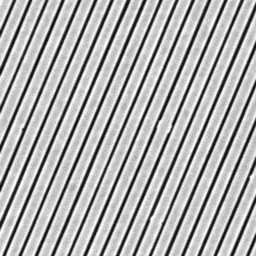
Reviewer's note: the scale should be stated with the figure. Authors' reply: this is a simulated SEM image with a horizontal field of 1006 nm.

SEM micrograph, parallel lines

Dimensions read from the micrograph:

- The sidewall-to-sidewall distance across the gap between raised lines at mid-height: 15.4 nm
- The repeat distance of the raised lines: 58.9 nm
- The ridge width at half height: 41.7 nm